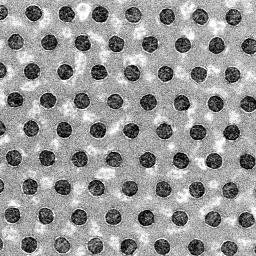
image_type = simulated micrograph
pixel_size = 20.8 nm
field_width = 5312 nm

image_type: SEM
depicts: a regular array of raised bodies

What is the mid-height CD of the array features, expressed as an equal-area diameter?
17.3 px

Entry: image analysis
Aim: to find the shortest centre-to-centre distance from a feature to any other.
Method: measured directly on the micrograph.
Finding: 684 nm